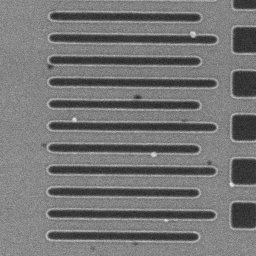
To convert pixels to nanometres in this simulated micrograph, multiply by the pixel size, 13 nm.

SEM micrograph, groups of lines, slits or small figures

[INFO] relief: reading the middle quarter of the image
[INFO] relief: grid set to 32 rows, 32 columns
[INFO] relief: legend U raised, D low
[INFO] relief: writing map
DDDDDDDDDDDDDDDDDDDDDDDDDDDDUUUU
DDDDDDDDDDDDDDDDDDDDDDDDDDDDDDDD
DDDDDDDDDDDDDDDDDDDDDDDDDDDDDDDD
UUUUUUUUUUUUUUUDDUUDDDDDDDDDDDDD
UUUUUUUUUUUUUUUUUUUUUUUUUUUUUUUU
UUUUUUUUUUUUUUUUUUUUUUUUUUUUUUUU
DDDDDDDDDDDDDDDDDDDDDDDDDDDDDDDD
DDDDDDDDDDDDDDDDDDDDDDDDDDDDDDDD
DDDDDDDDDDDDDDDDDDDDDDDDDDDDDDDD
UUUUUUUUUUUUUUUUUUUUUUUUUUUUUUUU
UUUUUUUUUUUUUUUUUUUUUUUUUUUUUUUU
DDDDDDDDDDDDDDDDUUUUUUUUUUUUUUUU
DDDDDDDDDDDDDDDDDDDDDDDDDDDDDDDD
DDDDDDDDDDDDDDDDDDDDDDDDDDDDDDDD
UUUUUUUUUUUUUUUUUUUUUUUUUUUUUDDD
UUUUUUUUUUUUUUUUUUUUUUUUUUUUUUUU
UUUUUUUUUUUUUUUUUUUUUUUUUUUUUUUU
DDDDDDDDDDDDDDDDDDDDDDDDDDDDDDDD
DDDDDDDDDDDDDDDDDDDDDDDDDDDDDDDD
DDDDDDDDDDDDDDDDDDDDDDDDDDDDDDDD
UUUUUUUUUUUUUUUUUUUUUUUUUUUUUUUU
UUUUUUUUUUUUUUUUUUUUUUUUUUUUUUUU
DDDDDDDDDDDDDDDDDDDDDUUDDDDDUUUU
DDDDDDDDDDDDDDDDDDDDDDDDDDDDDDDD
DDDDDDDDDDDDDDDDDDDDDDDDDDDDDDDD
UUUUUUUUUUUUUUUUUUUUUUUUUUUUUUUD
UUUUUUUUUUUUUUUUUUUUUUUUUUUUUUUU
UUUUUUUUUUUUUUUUUUUUUUUUUUUUUUUU
DDDDDDDDDDDDDDDDDDDDDDDDDDDDDDDD
DDDDDDDDDDDDDDDDDDDDDDDDDDDDDDDD
DDDDDDDDDDDDDDDDDDDDDDDDDDDDDDDD
UUUUUUUUUUUUUUUUUUUUUUUUUUUUUUUU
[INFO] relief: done